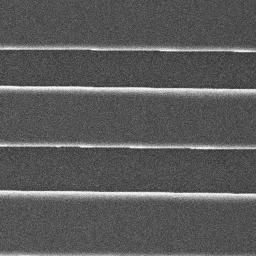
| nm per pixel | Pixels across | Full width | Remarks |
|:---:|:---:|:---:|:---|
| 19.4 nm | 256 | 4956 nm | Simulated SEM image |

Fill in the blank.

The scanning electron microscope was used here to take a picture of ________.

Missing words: lines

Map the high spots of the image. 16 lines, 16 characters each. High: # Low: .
################
################
################
................
................
##..............
################
################
################
................
................
................
################
################
################
################